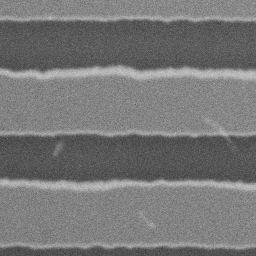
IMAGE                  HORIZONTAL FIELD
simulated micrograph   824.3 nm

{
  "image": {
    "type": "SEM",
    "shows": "lines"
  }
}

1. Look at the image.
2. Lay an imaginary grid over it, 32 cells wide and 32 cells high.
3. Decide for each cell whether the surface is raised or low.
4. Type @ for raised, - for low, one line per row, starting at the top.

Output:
@@@@@@@@@@@@@@@@@@@@@@@@@@@@@@@@
@@@@@@@@@@@@@@@@@@@@@@@@@@@@@@@@
--@@----@---@@------@@--@@--@@@@
--------------------------------
--------------------------------
--------------------------------
--------------------------------
--------------------------------
--------------@-----------------
@@@@@@@@@@@@@@@@@@@@@@@@@@@@@@@@
@@@@@@@@@@@@@@@@@@@@@@@@@@@@@@@@
@@@@@@@@@@@@@@@@@@@@@@@@@@@@@@@@
@@@@@@@@@@@@@@@@@@@@@@@@@@@@@@@@
@@@@@@@@@@@@@@@@@@@@@@@@@@@@@@@@
@@@@@@@@@@@@@@@@@@@@@@@@@@@@@@@@
@@@@@@@@@@@@@@@@@@@@@@@@@@@@@@@@
@@@@@@@@@@@@@@@@@@@@@@@@@@@@@@@@
--------------------------------
--------------------------------
--------------------------------
--------------------------------
--------------------------------
@-------------------------------
@@@@@@@@@@@@@@@@@@@@@@@@@@@@@@@@
@@@@@@@@@@@@@@@@@@@@@@@@@@@@@@@@
@@@@@@@@@@@@@@@@@@@@@@@@@@@@@@@@
@@@@@@@@@@@@@@@@@@@@@@@@@@@@@@@@
@@@@@@@@@@@@@@@@@@@@@@@@@@@@@@@@
@@@@@@@@@@@@@@@@@@@@@@@@@@@@@@@@
@@@@@@@@@@@@@@@@@@@@@@@@@@@@@@@@
@@@@@@@@@@@@@@@@@@@@@@@@@@@@@@@@
--------------------------------